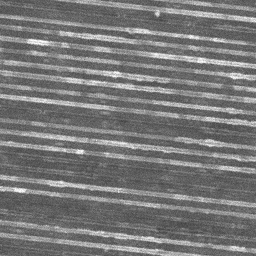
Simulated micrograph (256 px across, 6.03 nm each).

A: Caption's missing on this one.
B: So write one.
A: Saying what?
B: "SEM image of parallel lines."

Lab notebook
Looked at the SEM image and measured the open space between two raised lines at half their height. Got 47.9 nanometers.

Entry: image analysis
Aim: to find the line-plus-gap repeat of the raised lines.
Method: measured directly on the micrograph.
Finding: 69.3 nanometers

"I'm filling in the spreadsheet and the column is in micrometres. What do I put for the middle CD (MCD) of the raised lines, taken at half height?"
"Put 0.0217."